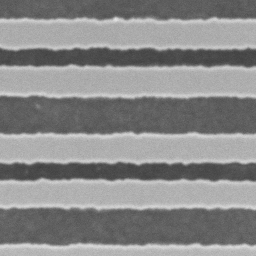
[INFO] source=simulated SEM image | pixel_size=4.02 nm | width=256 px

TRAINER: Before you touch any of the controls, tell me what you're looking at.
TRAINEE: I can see lines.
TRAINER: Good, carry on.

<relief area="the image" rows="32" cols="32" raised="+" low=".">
................................
................................
++++++++++++..+++++..+..+.++++++
++++++++++++++++++++++++++++++++
++++++++++++++++++++++++++++++++
++++++++++++++++++++++++++++++++
................................
................................
++++++++++++++++++++++++++++++++
++++++++++++++++++++++++++++++++
++++++++++++++++++++++++++++++++
++++++++++++++++++++++++++++++++
................................
................................
................................
................................
................................
++++++++++++++++++++++++++++++++
++++++++++++++++++++++++++++++++
++++++++++++++++++++++++++++++++
.................+..............
................................
.....+...++.+..++.....+.........
++++++++++++++++++++++++++++++++
++++++++++++++++++++++++++++++++
++++++++++++++++++++++++++++++++
................................
................................
................................
................................
..++.....+......................
++++++++++++++++++++++++++++++++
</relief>